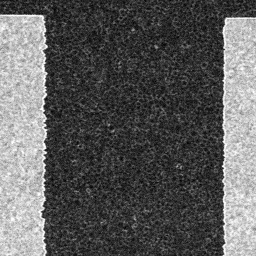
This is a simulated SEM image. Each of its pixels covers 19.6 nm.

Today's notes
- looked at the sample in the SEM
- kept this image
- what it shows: one or a few lines or trenches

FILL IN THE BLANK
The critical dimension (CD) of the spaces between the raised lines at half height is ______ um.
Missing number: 3.52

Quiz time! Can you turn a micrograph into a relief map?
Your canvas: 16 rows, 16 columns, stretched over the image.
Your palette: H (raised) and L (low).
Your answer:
LLLLLLLLLLLLLLLL
HHHLLLLLLLLLLLHH
HHHLLLLLLLLLLLHH
HHHLLLLLLLLLLLHH
HHHLLLLLLLLLLLHH
HHHLLLLLLLLLLLHH
HHHLLLLLLLLLLLHH
HHHLLLLLLLLLLLHH
HHHLLLLLLLLLLLHH
HHHLLLLLLLLLLLHH
HHHLLLLLLLLLLLHH
HHHLLLLLLLLLLLHH
HHHLLLLLLLLLLLHH
HHHLLLLLLLLLLLHH
HHHLLLLLLLLLLLHH
HHHLLLLLLLLLLLHH